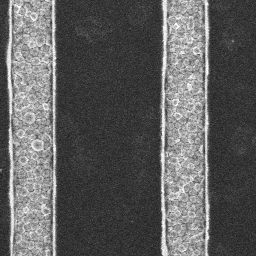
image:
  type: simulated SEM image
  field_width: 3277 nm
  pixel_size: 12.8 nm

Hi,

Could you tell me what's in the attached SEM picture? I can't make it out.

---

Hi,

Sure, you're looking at one or a few lines or trenches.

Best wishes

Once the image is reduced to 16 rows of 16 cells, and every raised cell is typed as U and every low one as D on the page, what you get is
UDDUUUUUUUDDDUUU
UDDUUUUUUUDDDUUU
UDDUUUUUUUDDDUUU
UDDUUUUUUUDDDUUU
UDDUUUUUUUDDDUUU
UDDUUUUUUUDDDUUU
UDDUUUUUUUDDDUUU
UDDUUUUUUUDDDUUU
UDDUUUUUUUDDDUUU
UDDUUUUUUUDDDUUU
UDDUUUUUUUDDDUUU
UDDUUUUUUUDDDUUU
UDDUUUUUUUDDDUUU
UDDUUUUUUUDDDUUU
UDDUUUUUUUDDDUUU
UDDUUUUUUUDDDUUU